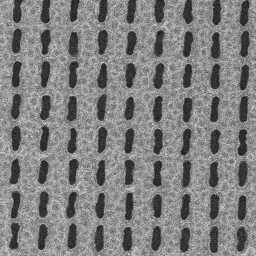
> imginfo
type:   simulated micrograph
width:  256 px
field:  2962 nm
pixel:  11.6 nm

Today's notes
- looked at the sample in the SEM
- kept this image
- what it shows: a regular array of holes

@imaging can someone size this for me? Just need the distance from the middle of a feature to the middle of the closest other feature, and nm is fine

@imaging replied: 324